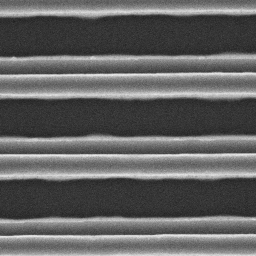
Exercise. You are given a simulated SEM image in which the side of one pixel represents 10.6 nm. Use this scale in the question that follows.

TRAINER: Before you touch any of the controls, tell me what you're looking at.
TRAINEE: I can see lines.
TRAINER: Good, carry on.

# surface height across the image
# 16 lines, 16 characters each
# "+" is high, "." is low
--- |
++++++++++++++++
................
................
................
++++++++++++++++
++++++++++++++++
................
................
................
++++++++++++++++
++++++++++++++++
................
................
................
++++++++++++++++
++++++++++++++++